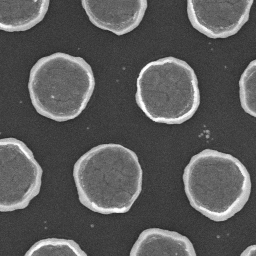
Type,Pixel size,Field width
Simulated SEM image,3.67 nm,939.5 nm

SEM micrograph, raised bodies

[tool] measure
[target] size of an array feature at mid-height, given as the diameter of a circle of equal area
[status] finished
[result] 0.234 µm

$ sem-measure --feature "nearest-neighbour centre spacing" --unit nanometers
384